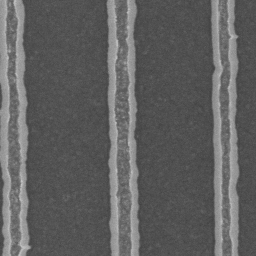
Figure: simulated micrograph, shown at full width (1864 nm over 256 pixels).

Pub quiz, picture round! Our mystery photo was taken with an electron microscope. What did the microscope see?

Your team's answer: one or a few lines or trenches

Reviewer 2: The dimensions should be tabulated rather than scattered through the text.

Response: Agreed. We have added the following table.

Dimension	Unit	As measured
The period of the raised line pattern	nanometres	771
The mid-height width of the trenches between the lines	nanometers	641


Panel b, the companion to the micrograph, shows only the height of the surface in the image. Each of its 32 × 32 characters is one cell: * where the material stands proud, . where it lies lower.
**............**...........**...
**............**...........**...
***...........**...........**...
***...........**...........**...
***...........**...........**...
**............**...........**...
**............**...........**...
***...........**...........**...
***...........**...........**...
**............**...........**...
.**...........***..........**...
.**...........**...........**...
.**...........**...........**...
.**...........***..........**...
.**...........***..........**...
.**...........***..........**...
.**...........**...........**...
***...........**...........**...
.**...........***..........**...
***...........***..........**...
.**...........***..........**...
.**...........***..........**...
.**...........***..........**...
.**...........***..........**...
.**...........***..........**...
.**...........***..........**...
.**...........***..........**...
.**...........***..........**...
.**...........***..........**...
.**...........***..........**...
.**...........***..........**...
.**...........***..........**...